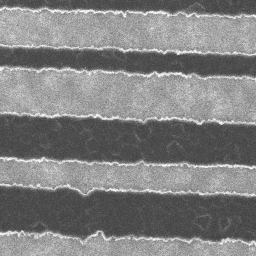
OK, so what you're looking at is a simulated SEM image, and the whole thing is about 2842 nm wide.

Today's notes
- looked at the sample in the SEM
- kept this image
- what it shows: one or a few lines or trenches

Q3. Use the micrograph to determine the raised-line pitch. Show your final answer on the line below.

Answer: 847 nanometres